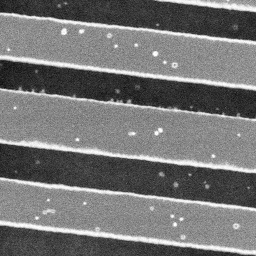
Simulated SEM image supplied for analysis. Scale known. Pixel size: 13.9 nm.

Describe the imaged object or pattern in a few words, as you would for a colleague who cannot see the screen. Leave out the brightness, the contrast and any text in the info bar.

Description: lines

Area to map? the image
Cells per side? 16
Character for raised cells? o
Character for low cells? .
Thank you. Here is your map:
..............oo
oooooo..........
ooooooooooooooo.
oooooooooooooooo
.......ooooooooo
...............o
oooooooo........
oooooooooooooooo
oooooooooooooooo
.....ooooooooooo
.............ooo
ooo.............
oooooooooooo....
oooooooooooooooo
....oooooooooooo
............oooo